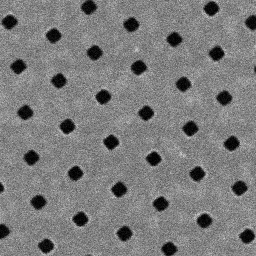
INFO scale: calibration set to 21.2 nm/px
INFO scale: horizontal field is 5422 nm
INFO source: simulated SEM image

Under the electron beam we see a regular array of holes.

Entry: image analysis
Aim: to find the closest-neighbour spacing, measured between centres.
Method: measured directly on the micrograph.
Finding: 44.4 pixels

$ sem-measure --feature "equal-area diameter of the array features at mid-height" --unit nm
324